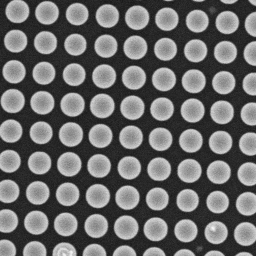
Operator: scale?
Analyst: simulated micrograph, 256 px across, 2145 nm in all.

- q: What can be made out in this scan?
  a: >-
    an array of small figures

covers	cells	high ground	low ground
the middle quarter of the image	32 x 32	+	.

.+++.....++.....................
+++++...++++...+++++...++++.....
+++++..++++++..+++++..+++++...++
+++++..++++++..+++++..++++++..++
.++++..++++++..+++++..++++++..++
........++++...+++++...++++...++
........................++.....+
.++.............................
+++++..+++++...++++.............
+++++..+++++..++++++..+++++...++
+++++..++++++.++++++..+++++...++
+++++..+++++..++++++..+++++..+++
++++...+++++...+++++..+++++..+++
................+++....+++....++
................................
++++....+++.....................
++++...+++++...++++...++++.....+
+++++.++++++..+++++...+++++..+++
+++++.++++++..++++++.++++++..+++
++++...+++++..+++++..++++++..+++
.+......+++....++++...++++...+++
.......................++.....++
+++.............................
++++...++++....+++.....+........
++++..+++++...+++++...++++...+++
++++..++++++..+++++..++++++..+++
++++..+++++...+++++..++++++..+++
+++....++++...+++++..+++++...+++
...............++.....++++...+++
..............................++
+++....+++.....+................
++++..+++++...++++....+++.....++